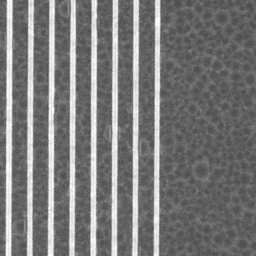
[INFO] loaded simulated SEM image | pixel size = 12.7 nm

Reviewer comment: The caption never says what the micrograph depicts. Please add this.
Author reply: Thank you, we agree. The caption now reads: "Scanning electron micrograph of parallel lines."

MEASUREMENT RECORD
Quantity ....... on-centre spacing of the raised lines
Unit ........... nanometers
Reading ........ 268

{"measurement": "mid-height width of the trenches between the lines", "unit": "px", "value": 17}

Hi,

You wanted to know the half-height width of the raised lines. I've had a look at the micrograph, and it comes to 4.37 px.